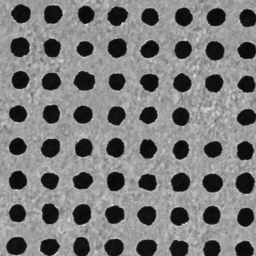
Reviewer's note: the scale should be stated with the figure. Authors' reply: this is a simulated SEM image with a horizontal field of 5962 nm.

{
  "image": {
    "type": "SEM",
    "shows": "a regular array of holes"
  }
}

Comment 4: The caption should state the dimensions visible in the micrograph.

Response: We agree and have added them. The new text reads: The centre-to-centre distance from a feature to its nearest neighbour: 0.749 um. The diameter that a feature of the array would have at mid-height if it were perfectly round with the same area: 444 nm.